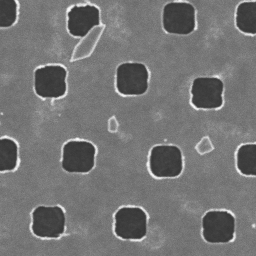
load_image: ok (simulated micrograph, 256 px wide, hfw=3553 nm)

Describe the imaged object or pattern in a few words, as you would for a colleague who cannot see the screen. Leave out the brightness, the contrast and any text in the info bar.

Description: a regular array of holes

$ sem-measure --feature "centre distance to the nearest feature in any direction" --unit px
71.7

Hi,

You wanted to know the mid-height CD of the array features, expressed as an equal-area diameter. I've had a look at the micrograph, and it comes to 0.471 micrometres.